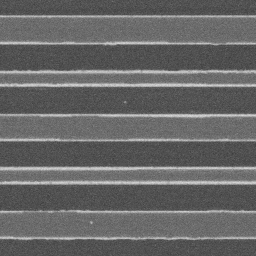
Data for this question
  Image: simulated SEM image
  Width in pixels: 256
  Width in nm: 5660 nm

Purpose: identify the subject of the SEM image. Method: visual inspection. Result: lines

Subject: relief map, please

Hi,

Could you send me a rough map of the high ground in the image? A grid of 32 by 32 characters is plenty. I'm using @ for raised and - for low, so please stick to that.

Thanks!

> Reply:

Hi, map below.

--------------------------------
--------------------------------
@@@@@@@@@@@@@@@@@@@@@@@@@@@@@@@@
@@@@@@@@@@@@@@@@@@@@@@@@@@@@@@@@
@@@@@@@@@@@@@@@@@@@@@@@@@@@@@@@@
--------------------------------
--------------------------------
--------------------------------
--------------------------------
@@@@@@@@@@@@@@@@@@@@@@@@@@@@@@@@
@@@@@@@@@@@@@@@@@@@@@@@@@@@@@@@@
--------------------------------
--------------------------------
--------------------------------
@@@@@@@@@@@@@@@@@@@@@@@@@@@@@@@@
@@@@@@@@@@@@@@@@@@@@@@@@@@@@@@@@
@@@@@@@@@@@@@@@@@@@@@@@@@@@@@@@@
--------@@@@-@----------@@@---@@
--------------------------------
--------------------------------
--------------------------------
@@@@@@@@@@@@@@@@@@@@@@@@@@@@@@@@
@@@@@@@@@@@@@@@@@@@@@@@@@@@@@@@@
--------------------------------
--------------------------------
--------------------------------
@@@@@@@@@@@@@@@@@@@@@@@@@@@@@@@@
@@@@@@@@@@@@@@@@@@@@@@@@@@@@@@@@
@@@@@@@@@@@@@@@@@@@@@@@@@@@@@@@@
@@@@@@@@@@@@@@@@@@@@@@@@@@@@@@@@
--------------------------------
--------------------------------